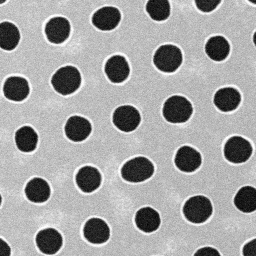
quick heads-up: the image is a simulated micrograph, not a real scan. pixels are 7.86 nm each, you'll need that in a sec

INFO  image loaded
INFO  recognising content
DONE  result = a regular array of holes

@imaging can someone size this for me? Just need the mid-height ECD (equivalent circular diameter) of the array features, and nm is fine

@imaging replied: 218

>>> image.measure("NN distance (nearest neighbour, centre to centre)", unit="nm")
399